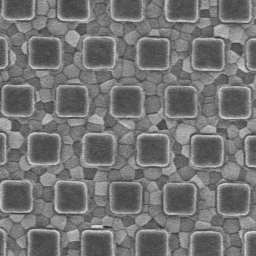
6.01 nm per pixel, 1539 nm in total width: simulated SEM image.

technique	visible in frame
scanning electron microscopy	a regular array of raised bodies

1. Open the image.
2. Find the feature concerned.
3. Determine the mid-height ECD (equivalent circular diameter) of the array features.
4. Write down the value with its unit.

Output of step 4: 211 nanometers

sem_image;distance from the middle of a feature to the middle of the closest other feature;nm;327